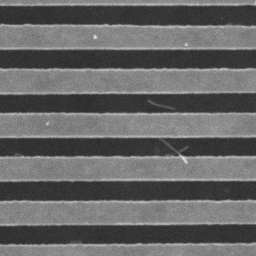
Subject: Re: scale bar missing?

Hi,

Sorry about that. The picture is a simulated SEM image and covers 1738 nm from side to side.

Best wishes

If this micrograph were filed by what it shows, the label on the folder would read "lines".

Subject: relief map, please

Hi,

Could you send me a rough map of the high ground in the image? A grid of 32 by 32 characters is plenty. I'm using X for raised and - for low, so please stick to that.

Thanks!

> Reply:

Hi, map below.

XXXXXXXXXXXXXXXXXXXXXXXXXXXXXXXX
--------------------------------
--------------------------------
XXXXXXXXXXXXXXXXXXXXXXXXXXXXXXXX
XXXXXXXXXXXXXXXXXXXXXXXXXXXXXXXX
XXXXXXXXXXXXXXXXXXXXXXXXXXXXXXXX
--------------------------------
--------------------------------
--------------------------------
XXXXXXXXXXXXXXXXXXXXXXXXXXXXXXXX
XXXXXXXXXXXXXXXXXXXXXXXXXXXXXXXX
XXXXXXXXXXXXXXXXXXXXXXXXXXXXXXXX
--------------------------------
--------------------------------
XXXXXXXXXXXXXXXXXXXXXXXXXXXXXXXX
XXXXXXXXXXXXXXXXXXXXXXXXXXXXXXXX
XXXXXXXXXXXXXXXXXXXXXXXXXXXXXXXX
--------------------------------
--------------------------------
----------------------X---------
XXXXXXXXXXXXXXXXXXXXXXXXXXXXXXXX
XXXXXXXXXXXXXXXXXXXXXXXXXXXXXXXX
XXXXXXXXXXXXXXXXXXXXXXXXXXXXXXXX
--------------------------------
--------------------------------
XXXXXXXXXXXXXXXXXXXXXXXXXXXXXXXX
XXXXXXXXXXXXXXXXXXXXXXXXXXXXXXXX
XXXXXXXXXXXXXXXXXXXXXXXXXXXXXXXX
--------------------------------
--------------------------------
--------------XX-XXXXXXXXXXXXXXX
XXXXXXXXXXXXXXXXXXXXXXXXXXXXXXXX